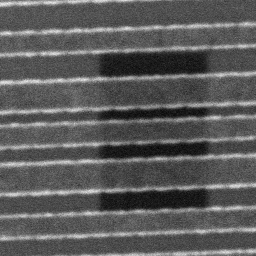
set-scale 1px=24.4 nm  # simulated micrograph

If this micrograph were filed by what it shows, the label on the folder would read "lines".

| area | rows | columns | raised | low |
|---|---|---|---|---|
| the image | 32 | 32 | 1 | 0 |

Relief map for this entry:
10000000000000000000000000000000
00000000000000000000000000000000
00000000000000000000000000000000
00000000000000000011111111111111
11111111111111111111111111111111
11111111111111111111111111111111
11111111111000000000000000000000
00000000000000000000000000000000
00000000000000000000000000000000
00000000000000000000001111111111
11111111111111111111111111111111
11111111111111111111111111111111
11111111111111111111111111111111
11111111111111110000000000000000
00000000000000000000000000000000
00000001111111111111111111111111
11111111111111111111111111111111
11111111111111111111111110000000
10000000000000000000000000000000
00000000000000000000000000001111
00001111111111111111111111111111
11111111111111111111111111111111
11111111111111111111111111111111
11111111111111111111111100000000
00000000000000000000000000000000
00000000000000000000000000000000
00000000000000001111111111111111
11111111111111111111111111111111
11111111111111111111111111111111
11111111111000000000000000000000
00000000000000000000000000000000
00000000000000000000000000000111